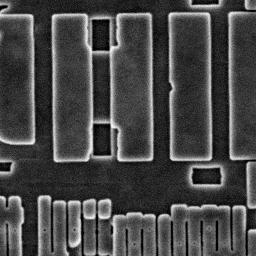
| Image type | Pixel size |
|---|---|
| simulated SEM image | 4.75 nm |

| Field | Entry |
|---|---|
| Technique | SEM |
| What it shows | wiring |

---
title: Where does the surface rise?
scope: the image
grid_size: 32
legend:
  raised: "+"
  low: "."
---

...............................+
..............................++
++++...++++....++++..+++++...+++
++++...++++....++++..+++++...+++
++++...++++....++++..+++++...+++
++++...++++....++++..+++++...+++
++++...++++...+++++..+++++...+++
++++...++++...+++++..+++++...+++
++++...++++...+++++..+++++...+++
++++...++++...+++++..+++++...+++
++++...+++++..+++++..+++++...+++
++++...+++++..+++++..+++++...+++
++++...+++++..+++++..+++++...+++
++++...+++++..+++++..+++++...+++
++++...+++++..+++++..+++++...+++
++++...+++++..+++++..+++++...+++
++++...++++....++++..+++++...+++
++++...++++....++++..+++++...+++
.......++++....++++..+++++...+++
.......++++....++++..+++++...+++
...............................+
...............................+
...............................+
...............................+
.....+.........................+
+++..+++++++++.................+
+++..+++++++++.......++++++++++.
+++..+++++....+++++++++++++++++.
+++..+++++....+++++++++++++++++.
+++..+++++....++++++++++++++++++
+++..+++++....++++++++++++++++++
+++..+++......++++++++++++++++++